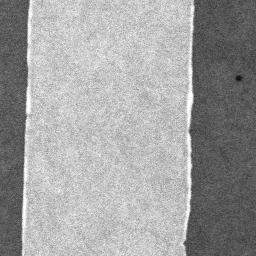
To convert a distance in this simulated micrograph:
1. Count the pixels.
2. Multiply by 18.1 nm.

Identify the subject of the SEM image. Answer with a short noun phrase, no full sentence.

one or a few lines or trenches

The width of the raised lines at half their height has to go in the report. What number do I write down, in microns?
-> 2.94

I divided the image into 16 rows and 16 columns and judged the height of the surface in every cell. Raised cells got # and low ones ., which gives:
..##########....
..##########....
..##########....
..##########....
..##########....
..##########....
..##########....
..##########....
..##########....
..##########....
..##########....
..##########....
..##########....
.###########....
..##########....
.###########....